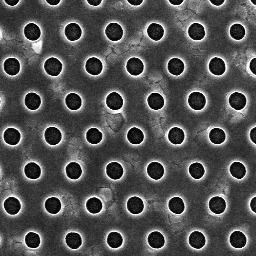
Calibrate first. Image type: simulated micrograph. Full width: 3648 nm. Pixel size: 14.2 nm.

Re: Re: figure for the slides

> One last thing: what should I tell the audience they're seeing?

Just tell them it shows a regular array of holes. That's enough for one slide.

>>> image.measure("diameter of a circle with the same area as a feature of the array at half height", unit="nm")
248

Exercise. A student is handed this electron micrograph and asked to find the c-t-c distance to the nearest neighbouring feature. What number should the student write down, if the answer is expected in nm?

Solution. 572